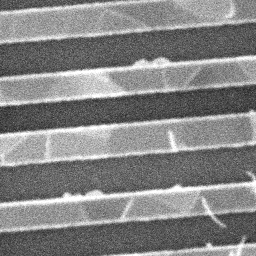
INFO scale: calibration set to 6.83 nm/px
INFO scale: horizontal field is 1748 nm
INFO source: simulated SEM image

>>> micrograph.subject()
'lines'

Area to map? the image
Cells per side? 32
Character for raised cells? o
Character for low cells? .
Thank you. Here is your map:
...........ooooooooooooooooooooo
.ooooooooooooooooooooooooooooooo
oooooooooooooooooooooooooooooooo
oooooooooooooooooooooo..........
oooooooooo......................
................................
................................
..........................oooooo
...............ooooooooooooooooo
...ooooooooooooooooooooooooooooo
oooooooooooooooooooooooooooooooo
oooooooooooooooooooo............
oooooooo........................
................................
...........................ooooo
................oooooooooooooooo
....oooooooooooooooooooooooooooo
oooooooooooooooooooooooooooooooo
oooooooooooooooooooooooooo......
oooooooooooooo..................
ooo.............................
................................
................................
........................oooooooo
.............ooooooooooooooooooo
oooooooooooooooooooooooooooooooo
ooooooooooooooooooooooooooooo...
ooooooooooooooooo...............
ooooo...........................
................................
................................
....................oooooooooooo